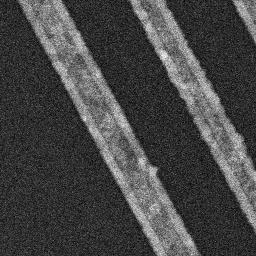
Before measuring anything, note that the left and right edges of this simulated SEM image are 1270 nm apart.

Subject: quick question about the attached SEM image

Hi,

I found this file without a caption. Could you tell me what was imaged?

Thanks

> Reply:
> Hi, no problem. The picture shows one or a few lines or trenches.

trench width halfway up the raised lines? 340 nanometers